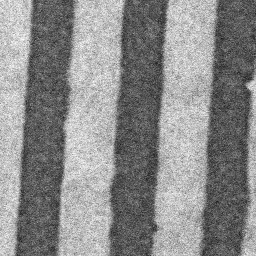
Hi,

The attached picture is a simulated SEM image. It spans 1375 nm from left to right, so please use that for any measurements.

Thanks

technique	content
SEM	one or a few lines or trenches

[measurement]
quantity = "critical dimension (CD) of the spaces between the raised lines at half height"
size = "255 nm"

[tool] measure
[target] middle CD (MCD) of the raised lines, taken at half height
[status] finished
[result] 0.239 µm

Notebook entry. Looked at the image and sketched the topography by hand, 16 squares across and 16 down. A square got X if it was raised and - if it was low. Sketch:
XX---XXX---XX---
XX---XXX---XX---
XX---XX---XXX---
XX---XX---XXX---
XX---XX---XXX---
X----XX---XXX---
X---XXX---XXX---
X---XXX---XXX---
X---XXX---XXX---
X---XXX---XXX---
X---XXX---XXX---
X---XXX---XXX---
X---XXX---XXX---
X---XXX---XX----
X---XXX---XX----
X---XXX---XX---X